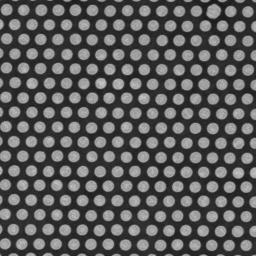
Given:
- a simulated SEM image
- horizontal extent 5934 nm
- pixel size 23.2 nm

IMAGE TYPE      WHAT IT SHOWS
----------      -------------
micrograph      a regular array of raised bodies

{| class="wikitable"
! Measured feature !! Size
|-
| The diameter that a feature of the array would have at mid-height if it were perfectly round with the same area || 0.264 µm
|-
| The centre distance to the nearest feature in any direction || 381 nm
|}